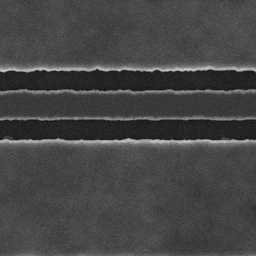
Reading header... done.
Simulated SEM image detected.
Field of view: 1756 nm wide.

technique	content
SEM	lines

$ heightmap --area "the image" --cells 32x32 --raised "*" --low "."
********************************
********************************
********************************
********************************
********************************
********************************
********************************
********************************
********************************
................................
................................
********************************
********************************
********************************
********************************
................................
................................
*.**.***......*******..****..***
********************************
********************************
********************************
********************************
********************************
********************************
********************************
********************************
********************************
********************************
********************************
********************************
********************************
********************************